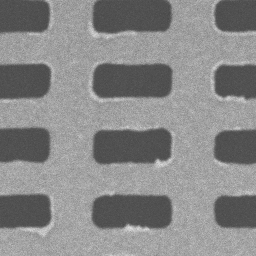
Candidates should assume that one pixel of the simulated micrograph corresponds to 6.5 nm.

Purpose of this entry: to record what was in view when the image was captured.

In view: holes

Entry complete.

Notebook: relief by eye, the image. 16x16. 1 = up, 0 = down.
0001110000011000
0001110000011100
1111111111111111
1111111111111111
0001110000011000
0001110000011000
1111111111111111
1111111111111111
0001110000011100
0001110000011000
1111111111111111
1111111111111111
0001110000011100
0001110000011000
1111111111111111
1111111111111111